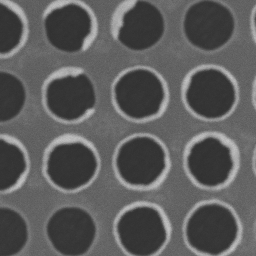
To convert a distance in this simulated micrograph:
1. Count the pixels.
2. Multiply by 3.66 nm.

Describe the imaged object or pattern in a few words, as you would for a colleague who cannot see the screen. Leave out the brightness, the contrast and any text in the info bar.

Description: a regular array of holes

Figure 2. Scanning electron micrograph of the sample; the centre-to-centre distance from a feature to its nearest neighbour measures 67.6 pixels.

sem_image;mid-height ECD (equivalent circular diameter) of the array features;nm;175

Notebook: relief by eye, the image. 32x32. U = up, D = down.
UUUUUUUUUUUUUUUUUDDUUUUUDDDDUUUU
DDUUUUDDDDDUUUUUDDDDUUUDDDDDDUUU
DDDUUUDDDDDUUUUDDDDDUUUDDDDDDUUU
DDDUUUDDDDDUUUUDDDDDUUUDDDDDDUUU
DDDUUUDDDDDUUUUDDDDDUUUDDDDDDUUU
DDUUUUDDDDUUUUUDDDDUUUUUDDDDUUUU
DUUUUUUUDUUUUUUUUUUUUUUUUUUUUUUU
UUUUUUUUUUUUUUUUUUUUUUUUUUUUUUUU
UUUUUUUUUUUUUUUUUUUUUUUUUUUUUUUU
DDUUUUUUDDDUUUUDDDDUUUUUDDDDUUUU
DDDUUUDDDDDDUUUDDDDDUUUUDDDDDUUU
DDDUUUDDDDDDUUDDDDDDUUUDDDDDDUUU
DDDUUUDDDDDDUUDDDDDDUUUDDDDDDUUU
DDDUUUDDDDDUUUUDDDDDUUUUDDDDDUUU
DDUUUUUDDDUUUUUUDDDUUUUUUDDDUUUU
UUUUUUUUUUUUUUUUUUUUUUUUUUUUUUUU
UUUUUUUUUUUUUUUUUUUUUUUUUUUUUUUU
UUUUUUUUUUUUUUUUDDDUUUUUUDDUUUUU
DDUUUUUDDDDUUUUDDDDDUUUUDDDDUUUU
DDDUUUDDDDDDUUUDDDDDDUUUDDDDDUUU
DDDUUUDDDDDDUUUDDDDDDUUUDDDDDUUU
DDDUUUDDDDDDUUUDDDDDUUUUDDDDDUUU
DDUUUUDDDDDUUUUUDDDUUUUUUDDDUUUU
DUUUUUUUDUUUUUUUUUUUUUUUUUUUUUUU
UUUUUUUUUUUUUUUUUUUUUUUUUUUUUUUU
UUUUUUUUUUUUUUUUUUUUUUUUUUUUUUUU
DDUUUUUDDDDUUUUUDDDDUUUUDDDDDUUU
DDDUUUDDDDDDUUUDDDDDUUUUDDDDDUUU
DDDUUUDDDDDDUUUDDDDDDUUDDDDDDDUU
DDDUUUDDDDDDUUUDDDDDDUUDDDDDDDUU
DDDUUUDDDDDUUUUDDDDDUUUUDDDDDUUU
DDUUUUUDDDDUUUUUDDDUUUUUUDDDUUUU